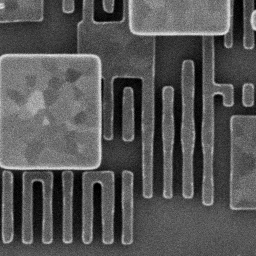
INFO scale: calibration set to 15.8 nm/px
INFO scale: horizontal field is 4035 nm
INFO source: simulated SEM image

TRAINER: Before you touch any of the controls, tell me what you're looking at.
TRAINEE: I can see wiring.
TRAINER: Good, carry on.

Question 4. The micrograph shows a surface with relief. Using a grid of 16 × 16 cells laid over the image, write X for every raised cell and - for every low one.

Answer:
--------XXXXXX--
--------XXXXXX--
----------------
XXXXXX----------
XXXXXX----------
XXXXXX----------
XXXXXX----------
XXXXXX----------
XXXXXX----------
XXXXXX----------
XXXXXX----------
----------------
----------------
----------------
----------------
----------------